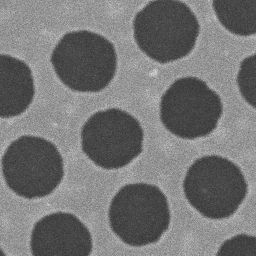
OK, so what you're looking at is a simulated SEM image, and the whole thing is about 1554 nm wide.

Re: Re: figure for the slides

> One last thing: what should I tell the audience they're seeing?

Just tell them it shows holes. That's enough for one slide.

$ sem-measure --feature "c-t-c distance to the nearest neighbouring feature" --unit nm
488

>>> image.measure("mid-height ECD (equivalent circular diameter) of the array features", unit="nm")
388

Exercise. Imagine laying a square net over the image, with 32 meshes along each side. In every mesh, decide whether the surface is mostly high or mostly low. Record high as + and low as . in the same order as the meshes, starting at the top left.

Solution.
++++++++++++++++++.....+++......
+++++++++++++++++.......+++.....
+++++++++++++++++........++.....
+++++++++++++++++........+++....
++++++++.....++++........+++++.+
+++++++.......+++.......++++++++
++++++.........+++......++++++++
...+++.........++++...++++++++..
....+++........+++++++++++++++..
....+++.......++++++++++++++++..
....++++......+++++++.....++++..
....++++++..+++++++++......+++..
....++++++++++++++++........+++.
....++++++++++.+++++........++++
..+++++++++......+++........++++
++++++++++........++.......+++++
++++++++++........+++......+++++
++....++++........++++++++++++++
+......+++........++++++++++++++
........+++......++++++++...++++
........++++....++++++++.....+++
........+++++++++++++++.......++
+.......+++++++++++++++........+
+......++++++++.....+++........+
++....++++++++.......++........+
++++++++++++++.......+++......++
+++++++.++++++.......++++....+++
+++++.....++++.......+++++++++++
++++.......+++.......+++++++++++
++++.......++++.....+++++++++...
++++........++++...+++++++++....
++++.......++++++++++++++++.....